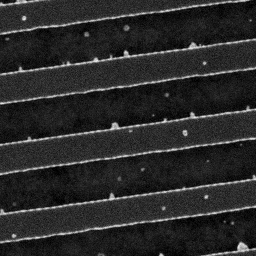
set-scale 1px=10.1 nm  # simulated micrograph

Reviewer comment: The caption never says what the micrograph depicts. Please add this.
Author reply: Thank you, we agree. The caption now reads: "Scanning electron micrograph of lines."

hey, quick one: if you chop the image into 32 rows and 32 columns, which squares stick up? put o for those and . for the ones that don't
.oooooooooooooooooooooooooo.....
ooooooooooooooooooo.............
ooooooooooooo...................
ooooo...........................
................................
...........................ooooo
....................oooooooooooo
.............ooooooooooooooooooo
......oooooooooooooooooooooooooo
ooooooooooooooooooooooooo.......
oooooooooooooooooo..............
ooooooooooo.....................
ooo.............................
................................
..........................oooooo
..................oooooooooooooo
...........ooooooooooooooooooooo
....oooooooooooooooooooooooooo..
oooooooooooooooooooooooo........
oooooooooooooooo................
ooooooooo.......................
oo..............................
...............................o
........................oooooooo
.................ooooooooooooooo
.........ooooooooooooooooooooooo
..oooooooooooooooooooooooooo....
ooooooooooooooooooooo...........
ooooooooooooo...................
oooooo..........................
................................
.............................ooo